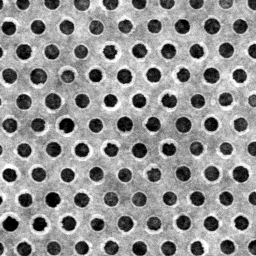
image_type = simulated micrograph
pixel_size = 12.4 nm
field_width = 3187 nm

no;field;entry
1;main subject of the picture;a regular array of holes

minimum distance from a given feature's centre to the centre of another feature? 345 nanometers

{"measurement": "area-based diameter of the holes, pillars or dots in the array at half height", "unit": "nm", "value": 196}